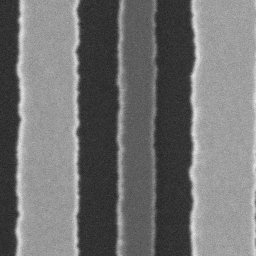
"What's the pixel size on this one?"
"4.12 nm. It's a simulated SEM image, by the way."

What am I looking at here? lines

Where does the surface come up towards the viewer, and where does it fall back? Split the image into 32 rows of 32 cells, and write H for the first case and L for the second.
LLLHHHHHHHLLLLLHHHHLLLLLHHHHHHHH
LLLHHHHHHLLLLLLHHHHLLLLLHHHHHHHH
LLLHHHHHHHLLLLLHHHHLLLLLHHHHHHHH
LLLHHHHHHHLLLLLHHHHLLLLLHHHHHHHH
LLLHHHHHHHLLLLLHHHHLLLLLLHHHHHHH
LLLHHHHHHHLLLLLHHHHLLLLLLHHHHHHH
LLLHHHHHHLLLLLLHHHHLLLLLLHHHHHHH
LLLHHHHHHHLLLLLHHHHLLLLLLHHHHHHH
LLHHHHHHHHLLLLLHHHHLLLLLHHHHHHHH
LLLHHHHHHHLLLLLHHHHLLLLLHHHHHHHH
LLLHHHHHHHLLLLLHHHHLLLLLHHHHHHHH
LLLHHHHHHHLLLLLHHHHLLLLLHHHHHHHH
LLLHHHHHHHLLLLLHHHHLLLLLHHHHHHHH
LLLHHHHHHHLLLLLHHHHLLLLLHHHHHHHH
LLLHHHHHHHLLLLLHHHHLLLLLHHHHHHHH
LLLHHHHHHHLLLLLHHHHLLLLLHHHHHHHH
LLLHHHHHHLLLLLLHHHHLLLLLHHHHHHHH
LLLHHHHHHHLLLLLHHHHLLLLLHHHHHHHH
LLLHHHHHHHLLLLLHHHHLLLLLLHHHHHHH
LLLHHHHHHHLLLLLHHHHLLLLLHHHHHHHH
LLLHHHHHHHLLLLLHHHHLLLLLHHHHHHHH
LLHHHHHHHHLLLLLHHHHLLLLLHHHHHHHH
LLHHHHHHHHLLLLLHHHHLLLLLHHHHHHHH
LLHHHHHHHHLLLLLHHHHLLLLLHHHHHHHH
LLLHHHHHHHLLLLLHHHHLLLLLHHHHHHHH
LLLHHHHHHHLLLLLHHHHLLLLLLHHHHHHH
LLLHHHHHHHLLLLLHHHHLLLLLHHHHHHHH
LLHHHHHHHHLLLLLHHHHLLLLLHHHHHHHH
LLHHHHHHHHLLLLLHHHHLLLLLHHHHHHHH
LLHHHHHHHHLLLLLHHHHLLLLLHHHHHHHH
LLHHHHHHHHLLLLLHHHHLLLLLHHHHHHHH
LLHHHHHHHHLLLLLHHHHLLLLLHHHHHHHH